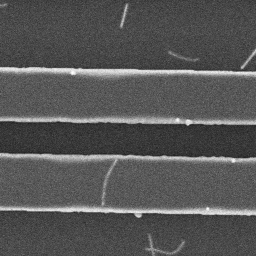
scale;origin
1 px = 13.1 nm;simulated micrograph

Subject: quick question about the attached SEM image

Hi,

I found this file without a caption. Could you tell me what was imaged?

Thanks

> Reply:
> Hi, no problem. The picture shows lines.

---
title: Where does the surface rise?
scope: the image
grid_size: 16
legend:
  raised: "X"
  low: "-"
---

----------------
----------------
----------------
----------------
XXXXXXXXXXXXXX--
XXXXXXXXXXXXXXXX
XXXXXXXXXXXXXXXX
XXXXXXXXXXXXXXXX
----------------
----------------
XXXXXXXXXXXXXXXX
XXXXXXXXXXXXXXXX
XXXXXXXXXXXXXXXX
----------------
----------------
----------------